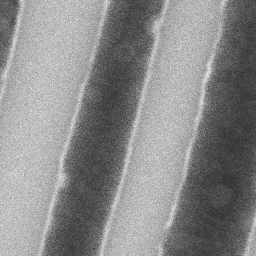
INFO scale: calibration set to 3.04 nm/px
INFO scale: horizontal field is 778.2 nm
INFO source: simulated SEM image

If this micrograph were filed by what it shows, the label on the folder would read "one or a few lines or trenches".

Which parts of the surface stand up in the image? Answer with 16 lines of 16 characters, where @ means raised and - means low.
@------@@@----@@
@-----@@@@----@@
@-----@@@@----@@
@-----@@@@---@@@
------@@@----@@@
-----@@@@----@@@
-----@@@@----@@@
-----@@@@---@@@@
----@@@@----@@@@
----@@@@----@@@@
----@@@@----@@@@
----@@@@---@@@@@
---@@@@----@@@@@
---@@@@----@@@@@
---@@@@---@@@@@@
---@@@----@@@@@@